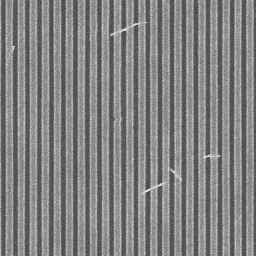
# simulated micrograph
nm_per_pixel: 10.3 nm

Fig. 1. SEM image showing parallel lines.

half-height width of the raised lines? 69.5 nm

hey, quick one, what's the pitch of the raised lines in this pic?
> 0.124 microns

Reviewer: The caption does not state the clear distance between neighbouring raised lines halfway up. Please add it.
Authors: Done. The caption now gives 57.9 nanometres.